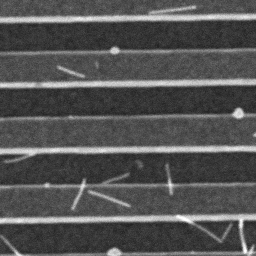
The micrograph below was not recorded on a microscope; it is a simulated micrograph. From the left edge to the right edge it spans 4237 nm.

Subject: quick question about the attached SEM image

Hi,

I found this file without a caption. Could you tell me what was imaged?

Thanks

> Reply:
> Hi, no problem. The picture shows lines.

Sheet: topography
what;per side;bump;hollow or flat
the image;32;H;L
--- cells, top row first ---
HHHHHHHHHHHHHHHHHHHHHHHHHHHHHHHH
HHHHHHHHHHHHHHHHHHHHHHHHHHHHHHHH
HHHHHHHHHHHHHHHHHHHHLLLLLLLLLLLL
LLLLLLLLLLLLLLLLLLLLLLLLLLLLLLLL
LLLLLLLLLLLLLLLLLLLLLLLLLLLLLLLL
LLLLLLLLLLLLLLLLLLLLLLLLLLLLLLLL
LLLLLLLLLLLLHHHHHHHHHHHHHHHHHHHH
HHHHHHHHHHHHHHHHHHHHHHHHHHHHHHHH
HHHHHHHHHHHHHHHHHHHHHHHHHHHHHHHH
HHHHHHHHHHHHHHHHHHHHHHHHHHHHHHHH
HHHHHHHHHHHHHHHHHHHHHHHHHHHHHLLL
LLLLLLLLLLLLLLLLLLLLLLLLLLLLLLLL
LLLLLLLLLLLLLLLLLLLLLLLLLLLLLLLL
LLLLLLLLLLLLLLLLLLLLLLLLLLLLLLLL
LLLLLLLLLLLLLLLLLLLLLLLLLHHHHHHH
HHHHHHHHHHHHHHHHHHHHHHHHHHHHHHHH
HHHHHHHHHHHHHHHHHHHHHHHHHHHHHHHH
HHHHHHHHHHHHHHHHHHHHHHHHHHHHHHHH
HHHHHHHHHHHHHHHHHHHHHHHHHHHHHHHH
LLLLLLLLLLLLLLLLLLLLLLLLLLLLLLLL
LLLLLLLLLLLLLLLLLLLLLLLLLLLLLLLL
LLLLLLLLLLLLLLLLLLLLLLLLLLLLLLLL
LLLLLLLLLLLLLLLLLLLLLLLLLLLLLLLL
HHHHHHHHHHHHHHHHHHHHHHHHHHHHHHHH
HHHHHHHHHHHHHHHHHHHHHHHHHHHHHHHH
HHHHHHHHHHHHHHHHHHHHHHHHHHHHHHHH
HHHHHHHHHHHHHHHHHHHHHHHHHHHHHHHH
HHHHHHHHHHHHHHHHHHHHHHHHHLLLLLHL
LLLLLLLLLLLLLLLLLLLLLLLLLLLLLLLL
LLLLLLLLLLLLLLLLLLLLLLLLLLLLLLLL
LLLLLLLLLLLLLLLLLLLLLLLLLLLLLLLL
LLLLLLLLLLLLLLHLLLLLLLLLLLLLLLHH